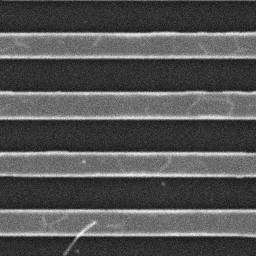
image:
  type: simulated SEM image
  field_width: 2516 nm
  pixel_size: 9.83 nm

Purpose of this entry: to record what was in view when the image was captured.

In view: lines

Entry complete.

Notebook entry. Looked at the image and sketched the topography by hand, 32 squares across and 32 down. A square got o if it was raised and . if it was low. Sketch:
................................
................................
................................
................................
oooooooooooooooooooooooooooooooo
oooooooooooooooooooooooooooooooo
oooooooooooooooooooooooooooooooo
................................
................................
................................
................................
.......................ooo..oo.o
oooooooooooooooooooooooooooooooo
oooooooooooooooooooooooooooooooo
oooooooooooooooooooooooooooooooo
................................
................................
................................
................................
oooooooooooooooooooooooooooooooo
oooooooooooooooooooooooooooooooo
oooooooooooooooooooooooooooooooo
................................
................................
................................
................................
oooooooooooooooooooooooooooooooo
oooooooooooooooooooooooooooooooo
oooooooooooooooooooooooooooooooo
.........o.....................o
................................
................................